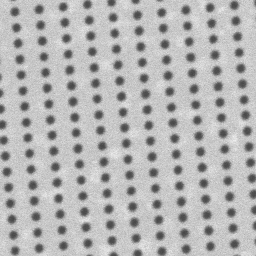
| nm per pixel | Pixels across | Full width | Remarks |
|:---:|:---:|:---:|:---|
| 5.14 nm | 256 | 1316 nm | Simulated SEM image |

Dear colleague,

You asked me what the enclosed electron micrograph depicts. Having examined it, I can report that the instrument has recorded a regular array of holes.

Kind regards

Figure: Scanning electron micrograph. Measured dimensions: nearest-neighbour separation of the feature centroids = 80.7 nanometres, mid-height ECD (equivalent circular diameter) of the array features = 0.0449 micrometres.